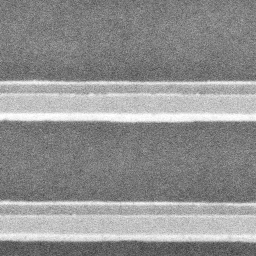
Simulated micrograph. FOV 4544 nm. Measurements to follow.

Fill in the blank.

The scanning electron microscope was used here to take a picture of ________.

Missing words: lines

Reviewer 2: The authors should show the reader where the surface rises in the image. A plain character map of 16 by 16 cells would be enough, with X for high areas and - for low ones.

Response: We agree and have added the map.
----------------
----------------
----------------
----------------
----------------
XXXXXXXXXXXXXXXX
XXXXXXXXXXXXXXXX
----------------
----------------
----------------
----------------
----------------
----------------
XXXXXXXXXXXXXXXX
XXXXXXXXXXXXXXXX
----------------